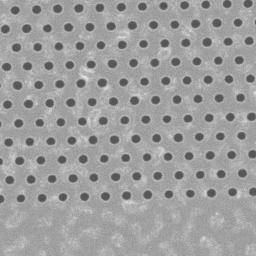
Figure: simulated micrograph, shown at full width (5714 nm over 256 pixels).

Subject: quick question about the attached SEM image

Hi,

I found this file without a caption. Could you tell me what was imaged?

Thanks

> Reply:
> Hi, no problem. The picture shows a regular array of holes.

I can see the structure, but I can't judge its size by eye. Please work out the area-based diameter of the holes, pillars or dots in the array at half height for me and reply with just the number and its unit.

206 nm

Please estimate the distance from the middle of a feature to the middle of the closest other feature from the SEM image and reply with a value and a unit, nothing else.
0.469 micrometres